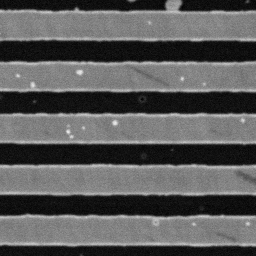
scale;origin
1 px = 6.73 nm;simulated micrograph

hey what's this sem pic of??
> lines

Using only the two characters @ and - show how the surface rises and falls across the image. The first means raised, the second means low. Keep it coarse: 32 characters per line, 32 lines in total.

--------------------------------
@@@@@@@@@@@@@@@-@@@@@@@---@@--@@
@@@@@@@@@@@@@@@@@@@@@@@@@@@@@@@@
@@@@@@@@@@@@@@@@@@@@@@@@@@@@@@@@
@@@@@@@@@@@@@@@@@@@@@@@@@@@@@@@@
--------------------------------
--------------------------------
--------------------------------
@@@@@@@@@@@@@@@@@@@@@@@@@@@@@@@@
@@@@@@@@@@@@@@@@@@@@@@@@@@@@@@@@
@@@@@@@@@@@@@@@@@@@@@@@@@@@@@@@@
--------------------------------
--------------------------------
--------------------------------
@@@@@@@@@@@@@@@@@@@@@@@@@@@@@@@@
@@@@@@@@@@@@@@@@@@@@@@@@@@@@@@@@
@@@@@@@@@@@@@@@@@@@@@@@@@@@@@@@@
@@@@@@@@@@@@@@@@@@@@@@@@@@@@@@@@
--------------------------------
--------------------------------
--------------------------------
@@@@@@@@@@@@@@@@@@@@@@@@@@@@@@@@
@@@@@@@@@@@@@@@@@@@@@@@@@@@@@@@@
@@@@@@@@@@@@@@@@@@@@@@@@@@@@@@@@
--------------------------------
--------------------------------
--------------------------------
@@@@@@@@@@@@@@@@@@@@@@@@@@@@@@@@
@@@@@@@@@@@@@@@@@@@@@@@@@@@@@@@@
@@@@@@@@@@@@@@@@@@@@@@@@@@@@@@@@
@@@@@@@@@@@@@@@@@@@@@@@@@@@@@@@@
--------------------------------